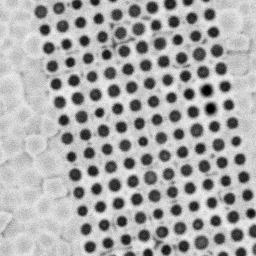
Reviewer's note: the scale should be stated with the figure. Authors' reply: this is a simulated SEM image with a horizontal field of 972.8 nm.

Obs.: a regular array of holes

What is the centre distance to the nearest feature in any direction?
68.9 nm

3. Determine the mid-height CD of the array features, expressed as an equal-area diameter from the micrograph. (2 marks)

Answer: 0.0431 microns